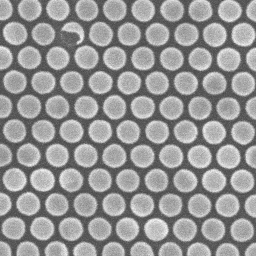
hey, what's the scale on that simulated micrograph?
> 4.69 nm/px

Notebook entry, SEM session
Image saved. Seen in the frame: a regular array of raised bodies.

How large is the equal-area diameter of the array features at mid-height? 106 nm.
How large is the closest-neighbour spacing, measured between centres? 27.8 pixels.